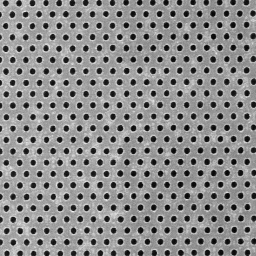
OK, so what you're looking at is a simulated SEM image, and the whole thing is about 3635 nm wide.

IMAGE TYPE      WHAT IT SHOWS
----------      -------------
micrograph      a regular array of holes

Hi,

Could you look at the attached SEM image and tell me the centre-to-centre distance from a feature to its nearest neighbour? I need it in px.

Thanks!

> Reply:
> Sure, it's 12.7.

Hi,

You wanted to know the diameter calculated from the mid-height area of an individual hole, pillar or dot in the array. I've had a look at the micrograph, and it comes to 92 nm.